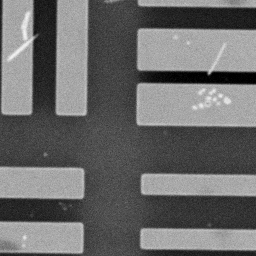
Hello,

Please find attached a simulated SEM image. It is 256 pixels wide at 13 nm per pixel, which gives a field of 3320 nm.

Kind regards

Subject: groups of lines, slits or small figures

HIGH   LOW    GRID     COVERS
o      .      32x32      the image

oooo...oooo.......oooooooooooooo
oooo...oooo.....................
oooo...oooo.....................
oooo...oooo.....................
oooo...oooo......ooooooooooooooo
oooo...oooo......ooooooooooooooo
oooo...oooo......ooooooooooooooo
oooo...oooo......ooooooooooooooo
oooo...oooo......ooooooooooooooo
oooo...oooo.....................
oooo...oooo.......ooooo.........
oooo...oooo......ooooooooooooooo
oooo...oooo......ooooooooooooooo
oooo...oooo......ooooooooooooooo
.................ooooooooooooooo
.................ooooooooooooooo
................................
................................
................................
................................
................................
oooooooooo......................
oooooooooo........oooooooooooooo
oooooooooo........oooooooooooooo
oooooooooo......................
................................
................................
................................
oooooooooo......................
oooooooooo........oooooooooooooo
oooooooooo........oooooooooooooo
oooooooooo......................